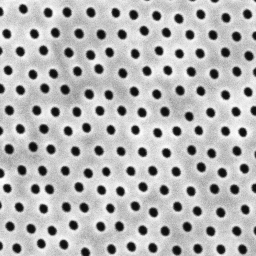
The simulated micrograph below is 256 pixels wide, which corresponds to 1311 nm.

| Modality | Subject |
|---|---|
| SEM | a regular array of holes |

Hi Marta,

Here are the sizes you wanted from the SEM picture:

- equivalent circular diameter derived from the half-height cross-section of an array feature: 53 nm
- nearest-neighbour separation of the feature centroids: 101 nm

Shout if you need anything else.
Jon